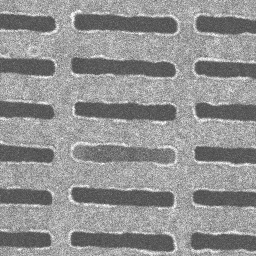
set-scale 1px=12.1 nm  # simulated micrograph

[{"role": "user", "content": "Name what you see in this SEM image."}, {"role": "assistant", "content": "holes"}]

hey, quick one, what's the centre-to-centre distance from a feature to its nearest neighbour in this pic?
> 526 nanometers